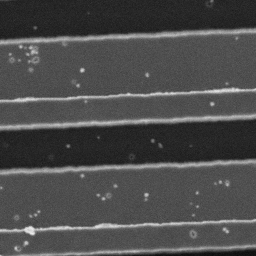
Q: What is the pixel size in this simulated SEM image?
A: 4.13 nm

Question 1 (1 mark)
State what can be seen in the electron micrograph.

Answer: lines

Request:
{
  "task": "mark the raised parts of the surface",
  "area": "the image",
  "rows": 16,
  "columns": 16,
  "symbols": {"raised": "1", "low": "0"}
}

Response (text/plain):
0000000000000000
0000000000000000
0001111111111111
1111111111111111
1111111111111111
1111111111111111
1111111111111111
1111111111100000
0000000000000000
0000000000000000
0000001111111111
1111111111111111
1111111111111111
1111111111111111
1111111111111111
1111111111111110